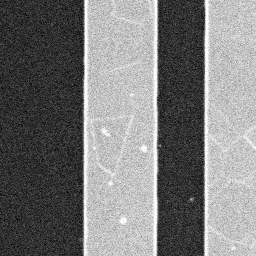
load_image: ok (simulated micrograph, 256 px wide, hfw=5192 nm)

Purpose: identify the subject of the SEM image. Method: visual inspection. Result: wiring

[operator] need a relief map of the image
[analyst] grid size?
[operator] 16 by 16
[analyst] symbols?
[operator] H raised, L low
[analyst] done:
LLLLLHHHHHLLLHHH
LLLLLHHHHHLLLHHH
LLLLLHHHHHLLLHHH
LLLLLHHHHHLLLHHH
LLLLLHHHHHLLLHHH
LLLLLHHHHHLLLHHH
LLLLLHHHHHLLLHHH
LLLLLHHHHHLLLHHH
LLLLLHHHHHLLLHHH
LLLLLHHHHHLLLHHH
LLLLLHHHHHLLLHHH
LLLLLHHHHHLLLHHH
LLLLLHHHHHLLLHHH
LLLLLHHHHHLLLHHH
LLLLLHHHHHLLLHHH
LLLLLHHHHHLLLHHH